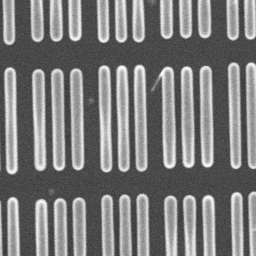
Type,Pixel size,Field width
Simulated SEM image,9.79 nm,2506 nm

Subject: groups of lines, slits or small figures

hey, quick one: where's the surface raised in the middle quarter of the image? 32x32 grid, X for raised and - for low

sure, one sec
--------------------------------
--XX-----XX---X---XX-----XX---XX
--XX-----XX---XX--XX----XXX---XX
--XX-----XX--XXX--XX-----XX---XX
--XX-----XX--XXX--XX-----XX---XX
--XXX----XX--XXX--XX-----XX---XX
--XXX----XX--XXX--XX-----XX---XX
--XXX----XX--XXX--XX-----XX---XX
--XXX----XX--XXX--XX-----XX---XX
--XXX----XX--XXX--XX-----XX---XX
--XXX----XX--XXX--XX-----XX---XX
--XXX----XX---XX--XX-----XX---XX
--XXX----XX---XX--XX-----XXX--XX
--XXX----XX---XX--XX-----XXX--XX
--XXX----XX---XX--XX-----XXX--XX
--XXX----XX---XX--XX-----XXX--XX
--XXX-----X---XX--XX-----XXX--XX
--XXX-----X---XX--XX-----XXX--XX
--XXX-----X---XX--XX-----XXX--XX
--XXX-----X---XX--XX-----XXX--XX
--XXX-----XX--XX--XX-----XXX--XX
--XXX-----XX--XX--XX-----XXX--XX
--XXX-----XX--XX--XX-----XXX--XX
--XXX-----XX--XX--XX-----XXX--XX
--XXX-----XX--XX--XX-----XXX--XX
--XXX-----XX--XX--XX------X----X
----------X---XX---X------------
--------------------------------
--------------------------------
--------------------------------
--------------------------------
--------------------------------